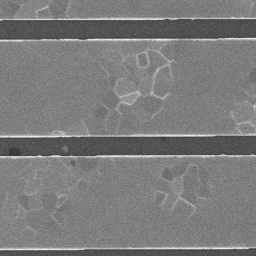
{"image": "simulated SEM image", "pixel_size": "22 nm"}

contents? lines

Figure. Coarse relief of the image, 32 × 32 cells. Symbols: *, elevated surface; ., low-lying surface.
********************************
********************************
*...............................
................................
................................
********************************
********************************
********************************
********************************
********************************
********************************
********************************
********************************
********************************
********************************
********************************
********************************
................................
................................
....*.***...********************
********************************
********************************
********************************
********************************
********************************
********************************
********************************
********************************
********************************
********************************
********************************
................................